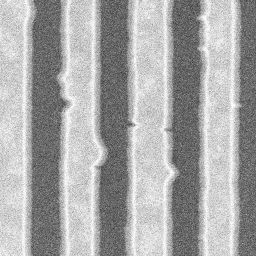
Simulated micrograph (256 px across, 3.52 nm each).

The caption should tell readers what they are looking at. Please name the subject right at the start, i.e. one or a few lines or trenches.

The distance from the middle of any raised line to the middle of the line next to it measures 0.244 micrometres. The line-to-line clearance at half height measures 0.124 um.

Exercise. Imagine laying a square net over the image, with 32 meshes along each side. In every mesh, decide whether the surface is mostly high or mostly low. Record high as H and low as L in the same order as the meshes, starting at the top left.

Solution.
HHHHLLLLHHHHLLLLLHHHHLLLLLHHHLLL
HHHHLLLLHHHHLLLLLHHHHLLLLLHHHHLL
HHHHLLLLHHHHLLLLLHHHHLLLLHHHHHLL
HHHLLLLLHHHHLLLLLHHHHLLLLLHHHLLL
HHHLLLLLHHHHLLLLLHHHHLLLLLHHHLLL
HHHHLLLLHHHHLLLLLHHHHLLLLHHHHLLL
HHHHLLLLHHHHLLLLHHHHHLLLLHHHHLLL
HHHHLLLLHHHHLLLLHHHHHLLLLLHHHLLL
HHHHLLLLHHHHLLLLHHHHHLLLLLHHHLLL
HHHLLLLLHHHHLLLLLHHHHLLLLLHHHLLL
HHHLLLLLHHHHLLLLLHHHHLLLLHHHHLLL
HHHLLLLLHHHHLLLLLHHHHLLLLHHHHLLL
HHHLLLLLHHHHLLLLLHHHHLLLLHHHHLLL
HHHLLLLLHHHHLLLLLHHHHLLLLHHHHLLL
HHHLLLLLHHHHLLLLLHHHHLLLLHHHHLLL
HHHLLLLLHHHHLLLLLHHHHLLLLHHHHLLL
HHHLLLLLHHHHLLLLHHHHHLLLLHHHHLLL
HHHLLLLLHHHHLLLLHHHHHLLLLHHHHLLL
HHHLLLLLHHHHHLLLHHHHHLLLLHHHHLLL
HHHLLLLLHHHHHLLLHHHHHLLLLHHHHLLL
HHHLLLLLHHHHLLLLHHHHHLLLLHHHHLLL
HHHLLLLLHHHHLLLLLHHHHHLLLLHHHLLL
HHHLLLLLHHHHLLLLLHHHHLLLLLHHHLLL
HHHLLLLLHHHHLLLLHHHHHLLLLLHHHLLL
HHHLLLLLHHHHLLLLHHHHHLLLLHHHHLLL
HHHLLLLLHHHHLLLLHHHHHLLLLHHHHLLL
HHHLLLLLHHHHLLLLHHHHHLLLLHHHHLLL
HHHLLLLLHHHHLLLLLHHHHLLLLHHHHLLL
HHHLLLLLHHHHLLLLHHHHHLLLLHHHHLLL
HHHLLLLLHHHHLLLLHHHHHLLLLHHHHLLL
HHHLLLLLHHHHLLLLHHHHHLLLLHHHHLLL
HHHLLLLLHHHHLLLLHHHHHLLLLLHHHLLL